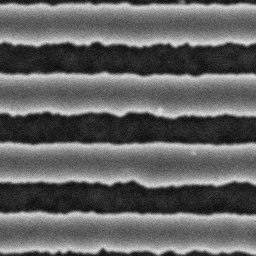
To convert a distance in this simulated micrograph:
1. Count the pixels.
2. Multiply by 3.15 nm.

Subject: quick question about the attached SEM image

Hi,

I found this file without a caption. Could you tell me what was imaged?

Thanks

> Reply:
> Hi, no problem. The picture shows lines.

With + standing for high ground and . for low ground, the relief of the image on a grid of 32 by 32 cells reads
.+..++..+++..+.+........+.....+.
++++++++++++++++++++++++++++++++
++++++++++++++++++++++++++++++++
++++++++++++++++++++++++++++++++
++++++++++++++++++++++++++++++++
..+++....++..+.++++..++.++++..+.
................................
................................
................................
++++++++++++++++++.+++++.+++++++
++++++++++++++++++++++++++++++++
++++++++++++++++++++++++++++++++
++++++++++++++++++++++++++++++++
++++++++++++++++++++++++++++++++
....................+++...+....+
................................
................................
................................
++++++++++++++++++++++++++++++++
++++++++++++++++++++++++++++++++
++++++++++++++++++++++++++++++++
++++++++++++++++++++++++++++++++
++++++++++++++++++++++++++++++++
................................
................................
................................
................................
++++++++++++++++++++++++++++++++
++++++++++++++++++++++++++++++++
++++++++++++++++++++++++++++++++
++++++++++++++++++++++++++++++++
+++...+..+++.......+..++..+++..+